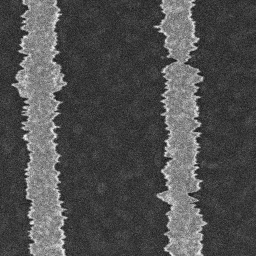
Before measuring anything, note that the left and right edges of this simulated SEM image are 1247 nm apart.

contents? one or a few lines or trenches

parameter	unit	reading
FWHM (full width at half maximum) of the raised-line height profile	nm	150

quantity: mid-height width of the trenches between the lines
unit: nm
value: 529